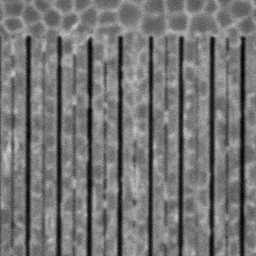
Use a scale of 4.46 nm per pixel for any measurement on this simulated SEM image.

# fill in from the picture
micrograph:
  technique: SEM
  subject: parallel lines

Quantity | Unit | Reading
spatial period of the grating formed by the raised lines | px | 15.1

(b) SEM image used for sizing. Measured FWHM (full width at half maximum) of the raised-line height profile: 11.6 px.